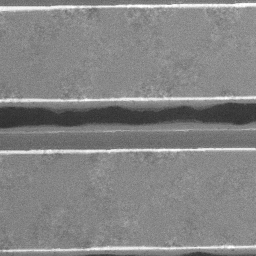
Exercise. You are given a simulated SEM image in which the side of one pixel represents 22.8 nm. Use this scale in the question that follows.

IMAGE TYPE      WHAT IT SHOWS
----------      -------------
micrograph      lines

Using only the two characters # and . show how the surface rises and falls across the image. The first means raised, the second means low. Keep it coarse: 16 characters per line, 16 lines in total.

################
################
################
################
################
################
................
................
################
################
################
################
################
################
################
##############..